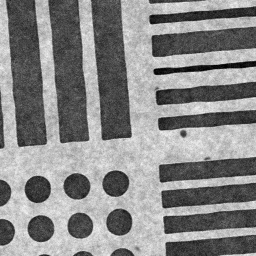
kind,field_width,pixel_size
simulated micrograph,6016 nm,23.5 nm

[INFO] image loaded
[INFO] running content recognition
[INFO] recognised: groups of lines, slits or small figures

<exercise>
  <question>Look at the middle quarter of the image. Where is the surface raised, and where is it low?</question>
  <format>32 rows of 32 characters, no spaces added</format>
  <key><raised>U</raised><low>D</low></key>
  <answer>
DDDDDUUUDDDDDDDDUUUUUUUUUUUUUUUU
DDDDDUUUDDDDDDDDUUUUUUDDDDDDDDDD
DDDDDUUUDDDDDDDDUUUUUUDDDDDUUUUU
DDDDDUUUDDDDDDDDUUUUUUUUUUUUUUUU
DDDDDUUUDDDDDDDDUUUUUUUUUUUUUUUU
DDDDDUUUUDDDDDDDUUUUUUUUUUUUUUUU
DDDDDDUUUDDDDDDDUUUUUUUDDDDDDDDD
DDDDDDUUUDDDDDDDUUUUUUUDDDDDDDDD
DDDDDDUUUDDDDDDDUUUUUUUDDDDDDDDD
DDDDDDUUUDDDDDDDDUUUUUUDDDDDDDDD
DDDDDDUUUDDDDDDDDUUUUUUUUUUUUUUU
DDDDDDUUUDDDDDDDDUUUUUUUUUUUUUUU
DDDDDDUUUDDDDDDDDUUUUUUUUUUUUUUU
DDDDDDUUUDDDDDDDDUUUUUUUDDDDDDDD
DDDDDDUUUDDDDDDDDUUUUUUDDDDDDDDD
DDDDDDUUUDDDDDDDDUUUUUUDDDDDDDDD
DDDDDDUUUDDDDDDDDUUUUUUUDDDUUUUU
DDDDDDUUUDDDDDDDDUUUUUUUUUUUUUUU
DDDDDDUUUDDDDDDDUUUUUUUUUUUUUUUU
DDDDDUUUUUUUUUUUUUUUUUUUUUUUUUUU
UUUUUUUUUUUUUUUUUUUUUUUUUUUUUUUU
UUUUUUUUUUUUUUUUUUUUUUUUUUUUUUUU
UUUUUUUUUUUUUUUUUUUUUUUUUUUUUUUU
UUUUUUUUUUUUUUUUUUUUUUUUUUUUUUUU
UUUUUUUUUUUUUUUUUUUUUUUUUUUUUUDD
UUUUUUUUUUUUUUUUUUUUUUUUDDDDDDDD
UUUUUUUUUUUUUUUUUUUUUUUUDDDDDDDD
UUDDUUUUUUUDDDDUUUUUUUUUDDDDDDDD
UDDDDDUUUUDDDDDDUUUUUUUUDDDDDDDD
DDDDDDDUUUDDDDDDDUUUUUUUDDDUUUUU
DDDDDDDUUUDDDDDDUUUUUUUUUUUUUUUU
DDDDDDDUUUDDDDDDUUUUUUUUUUDDDDDD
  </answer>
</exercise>